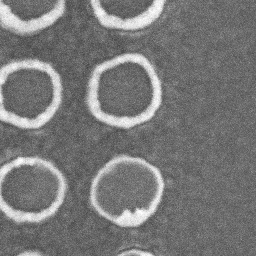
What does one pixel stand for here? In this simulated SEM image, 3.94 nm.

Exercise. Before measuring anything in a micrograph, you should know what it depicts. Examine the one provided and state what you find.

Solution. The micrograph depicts raised bodies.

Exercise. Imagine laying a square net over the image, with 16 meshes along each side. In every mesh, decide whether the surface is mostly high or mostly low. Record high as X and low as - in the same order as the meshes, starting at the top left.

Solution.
XXXX--XXXX------
-XX----XX-------
----------------
----------------
XXX---XXXX------
XXXX--XXXX------
XXXX--XXXX------
XXX----XX-------
----------------
----------------
XXX----XX-------
XXXX--XXXX------
XXXX--XXXX------
-XX----XX-------
----------------
----------------